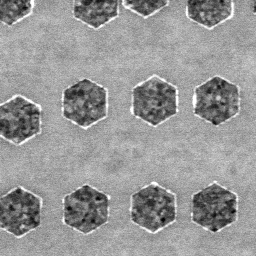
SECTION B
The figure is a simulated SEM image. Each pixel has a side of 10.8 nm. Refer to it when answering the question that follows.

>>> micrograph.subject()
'raised bodies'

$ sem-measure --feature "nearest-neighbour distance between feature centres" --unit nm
672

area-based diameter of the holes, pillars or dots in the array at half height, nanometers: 509